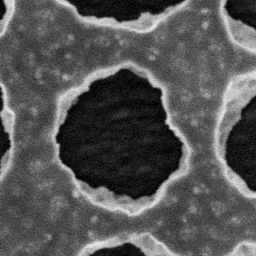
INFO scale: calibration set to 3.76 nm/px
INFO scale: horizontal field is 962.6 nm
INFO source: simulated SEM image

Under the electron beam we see holes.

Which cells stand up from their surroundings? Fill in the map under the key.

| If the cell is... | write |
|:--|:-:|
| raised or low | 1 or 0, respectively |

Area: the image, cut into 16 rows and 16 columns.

1111100000011100
1111111111111100
1111111111111111
1111111111111111
1111111001111111
1111110000111110
1111000000111100
1111000000111100
0111000000011100
0111000000001100
1111000000011100
1111100000111110
1111110001111111
1111111111111111
1111111111111111
1111111001111111